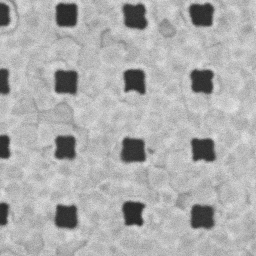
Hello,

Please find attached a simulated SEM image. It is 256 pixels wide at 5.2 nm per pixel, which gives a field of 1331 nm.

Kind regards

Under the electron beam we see a regular array of holes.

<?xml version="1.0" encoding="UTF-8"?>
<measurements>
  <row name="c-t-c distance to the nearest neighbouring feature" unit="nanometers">342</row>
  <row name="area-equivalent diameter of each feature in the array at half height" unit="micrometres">0.129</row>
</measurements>